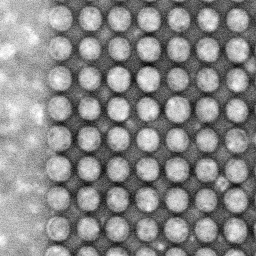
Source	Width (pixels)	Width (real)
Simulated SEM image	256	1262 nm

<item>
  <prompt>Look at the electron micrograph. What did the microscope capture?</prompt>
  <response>a regular array of raised bodies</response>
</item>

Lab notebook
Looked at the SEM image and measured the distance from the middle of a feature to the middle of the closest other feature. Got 145 nm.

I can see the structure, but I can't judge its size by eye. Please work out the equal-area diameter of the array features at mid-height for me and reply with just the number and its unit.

111 nm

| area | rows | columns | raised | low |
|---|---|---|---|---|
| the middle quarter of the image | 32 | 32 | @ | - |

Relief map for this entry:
--------------------------------
@----@@@----@@@----@@@@----@@@--
@---@@@@@--@@@@@---@@@@@--@@@@@-
@@--@@@@@--@@@@@--@@@@@@--@@@@@-
@@--@@@@@--@@@@@--@@@@@@--@@@@@-
@----@@@@--@@@@@---@@@@@---@@@--
-------------@@-----@@@-----@---
--------------------------------
------@------@-------------@@@--
@---@@@@----@@@@---@@@@---@@@@@-
@@--@@@@@--@@@@@--@@@@@---@@@@@-
@@--@@@@@--@@@@@--@@@@@---@@@@@-
@---@@@@@--@@@@@---@@@@---@@@@@-
@----@@@----@@@----@@@@---@@@@@-
--------------------------------
--------------------------------
@---@@@@----@@@-----@@-----@@---
@---@@@@@--@@@@@---@@@@---@@@@--
@@--@@@@@--@@@@@--@@@@@---@@@@@-
@---@@@@@--@@@@@--@@@@@---@@@@@-
@---@@@@----@@@@---@@@@---@@@@@-
-----@@-------------@@-----@@@--
--------------------------------
-----@@------@------------------
@---@@@@---@@@@@---@@@@---@@@@--
@@--@@@@@--@@@@@--@@@@@---@@@@@-
@@--@@@@@--@@@@@--@@@@@@--@@@@@-
@---@@@@@--@@@@@---@@@@---@@@@@-
@----@@@----@@@----@@@@---@@@@--
--------------------------------
--------------------------------
----@@@@----@@@----@@@-----@@@--